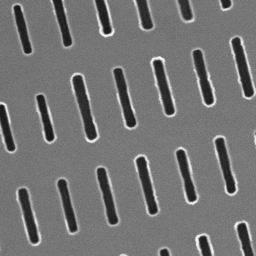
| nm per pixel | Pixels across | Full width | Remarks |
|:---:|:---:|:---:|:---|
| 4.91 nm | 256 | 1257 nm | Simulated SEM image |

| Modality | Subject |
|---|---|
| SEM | a regular array of holes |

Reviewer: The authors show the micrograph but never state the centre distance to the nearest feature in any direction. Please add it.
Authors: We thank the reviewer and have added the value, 199 nanometers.